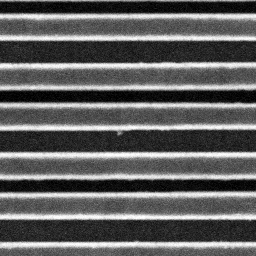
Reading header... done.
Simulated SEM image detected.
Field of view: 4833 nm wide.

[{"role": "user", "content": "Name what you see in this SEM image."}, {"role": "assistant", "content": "lines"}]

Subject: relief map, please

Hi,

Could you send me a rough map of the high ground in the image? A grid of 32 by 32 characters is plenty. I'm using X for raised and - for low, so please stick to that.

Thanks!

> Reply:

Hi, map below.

--------------------------------
--------------------------------
XXXXXXXXXXXXXXXXXXXXXXXXXXXXXXXX
XXXXXXXXXXXXXXXXXXXXXXXXXXXXXXXX
XXXXXXXXXXXXXXXXXXXXXXXXXXXXXXXX
--------------------------------
--------------------------------
--------------------------------
XXXXXXXXXXXXXXXXXXXXXXXXXXXXXXXX
XXXXXXXXXXXXXXXXXXXXXXXXXXXXXXXX
XXXXXXXXXXXXXXXXXXXXXXXXXXXXXXXX
--------------------------------
--------------------------------
XXXXXXXXXXXXXXXXXXXXXXXXXXXXXXXX
XXXXXXXXXXXXXXXXXXXXXXXXXXXXXXXX
XXXXXXXXXXXXXXXXXXXXXXXXXXXXXXXX
--------------------------------
--------------------------------
--------------------------------
XXXXXXXXXXXXXXXXXXXXXXXXXXXXXXXX
XXXXXXXXXXXXXXXXXXXXXXXXXXXXXXXX
XXXXXXXXXXXXXXXXXXXXXXXXXXXXXXXX
--------------------------------
--------------------------------
XXXXXXXXXXXXXXXXXXXXXXXXXXXXXXXX
XXXXXXXXXXXXXXXXXXXXXXXXXXXXXXXX
XXXXXXXXXXXXXXXXXXXXXXXXXXXXXXXX
--------------------------------
--------------------------------
--------------------------------
XXXXXXXXXXXXXXXXXXXXXXXXXXXXXXXX
XXXXXXXXXXXXXXXXXXXXXXXXXXXXXXXX